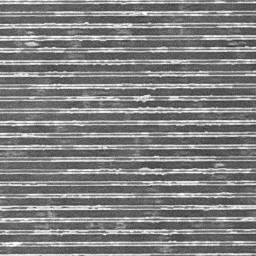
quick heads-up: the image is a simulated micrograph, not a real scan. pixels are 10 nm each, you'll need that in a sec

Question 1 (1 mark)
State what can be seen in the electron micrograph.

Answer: parallel lines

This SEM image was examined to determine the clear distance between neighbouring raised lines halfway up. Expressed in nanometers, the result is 81.5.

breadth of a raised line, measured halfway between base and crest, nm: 36.4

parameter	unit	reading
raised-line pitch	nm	122